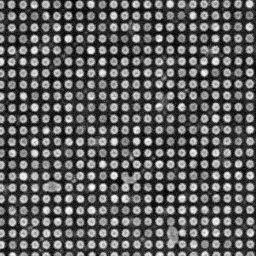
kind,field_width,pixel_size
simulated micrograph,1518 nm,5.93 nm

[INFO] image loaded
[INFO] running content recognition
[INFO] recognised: a regular array of raised bodies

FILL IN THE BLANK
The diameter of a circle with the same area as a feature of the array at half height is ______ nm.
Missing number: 40.7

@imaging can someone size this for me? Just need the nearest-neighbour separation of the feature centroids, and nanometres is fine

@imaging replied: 65